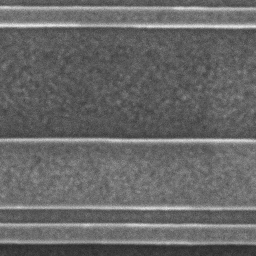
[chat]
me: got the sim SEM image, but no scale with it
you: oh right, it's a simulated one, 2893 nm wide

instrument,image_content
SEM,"lines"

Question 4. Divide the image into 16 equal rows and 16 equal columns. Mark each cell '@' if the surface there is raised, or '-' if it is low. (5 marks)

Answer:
@@@@@@@@@@@@@@@@
@@@@@@@@@@@@@@@@
----------------
----------------
----------------
----------------
----------------
----------------
----------------
@@@@@@@@@@@@@@@@
@@@@@@@@@@@@@@@@
@@@@@@@@@@@@@@@@
@@@@@@@@@@@@@@@@
@@@@@@@@@@@@@@@@
@@@@@@@@@@@@@@@@
----------------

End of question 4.